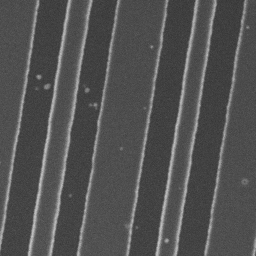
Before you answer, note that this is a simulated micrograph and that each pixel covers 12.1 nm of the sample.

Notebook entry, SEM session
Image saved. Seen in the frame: lines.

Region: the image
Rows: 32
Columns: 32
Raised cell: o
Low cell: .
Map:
ooooo...ooo....oooooo...ooo....o
ooooo...ooo....oooooo...ooo...oo
oooo....ooo...ooooooo...ooo...oo
oooo....ooo...ooooooo...oo....oo
oooo....ooo...oooooo....oo....oo
oooo....ooo...oooooo....oo....oo
oooo....oo....oooooo....oo....oo
oooo...ooo....oooooo...ooo...ooo
oooo...ooo...ooooooo...ooo...ooo
ooo....ooo...ooooooo...ooo...ooo
ooo....ooo...oooooo....oo....ooo
ooo....ooo...oooooo....oo....ooo
ooo....oo....oooooo....oo....ooo
ooo...ooo....oooooo...ooo...oooo
ooo...ooo...ooooooo...ooo...oooo
ooo...ooo...ooooooo...ooo...oooo
oo....ooo...oooooo....oo....oooo
oo....ooo...oooooo....oo....oooo
oo....oo....oooooo....oo....oooo
oo...ooo....oooooo....oo....oooo
oo...ooo....oooooo...ooo...ooooo
o....ooo...ooooooo...ooo...ooooo
o....ooo...oooooo....ooo...ooooo
o....ooo...oooooo....oo....ooooo
o....oo....oooooo....oo....ooooo
o....oo....oooooo....oo....ooooo
o...ooo....oooooo...ooo...oooooo
o...ooo...ooooooo...ooo...oooooo
....ooo...oooooo....ooo...oooooo
....ooo...oooooo....oo....oooooo
....ooo...oooooo....oo....oooooo
....oo....oooooo....oo....oooooo